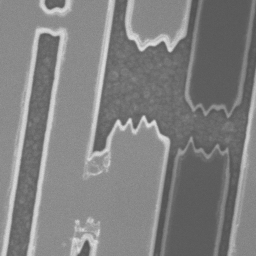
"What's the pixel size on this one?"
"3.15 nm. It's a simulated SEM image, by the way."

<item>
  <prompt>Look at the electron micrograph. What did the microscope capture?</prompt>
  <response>one or a few lines or trenches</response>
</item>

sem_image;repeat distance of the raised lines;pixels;66.2